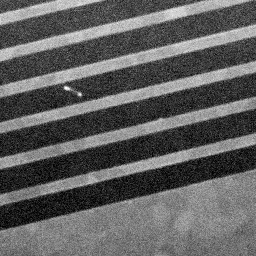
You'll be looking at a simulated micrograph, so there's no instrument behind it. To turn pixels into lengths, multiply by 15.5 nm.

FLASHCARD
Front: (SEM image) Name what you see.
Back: parallel lines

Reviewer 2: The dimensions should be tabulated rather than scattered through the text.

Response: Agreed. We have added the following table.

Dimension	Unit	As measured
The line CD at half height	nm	151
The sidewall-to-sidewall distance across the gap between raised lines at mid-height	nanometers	392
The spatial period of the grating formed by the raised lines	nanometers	543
